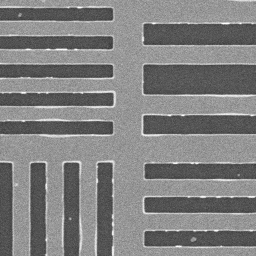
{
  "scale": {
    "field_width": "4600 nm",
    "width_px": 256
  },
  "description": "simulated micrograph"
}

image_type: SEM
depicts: groups of lines, slits or small figures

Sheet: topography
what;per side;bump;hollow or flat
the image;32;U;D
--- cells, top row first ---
UUUUUUUUUUUUUUUUUUUUUUUUUUUUUUUU
DDDDDDDDDDDDDDUUUUUUUUUUUUUUUUUU
DDDDDDDDDDDDDDUUUUUUUUUUUUUUUUUU
UUUUUUUUUUUUUUUUUUDDDDDDDDDDDDDD
DDDDDDDDDDDDDDUUUUDDDDDDDDDDDDDD
DDDDDDDDDDDDDDUUUUDDDDDDDDDDDDDD
UUUUUUUUUUUUUUUUUUUUUUUUUUUUUUUU
UUUUUUUUUUUUUUUUUUUUUUUUUUUUUUUU
DDDDDDDDDDDDDDUUUUDDDDDDDDDDDDDD
DDDDDDDDDDDDDDUUUUDDDDDDDDDDDDDD
UUUUUUUUUUUUUUUUUUDDDDDDDDDDDDDD
UUUUUUUUUUUUDDUUUUDDDDDDDDDDDDDD
DDDDDDDDDDDDDDUUUUUUUUUUUUUUUUUU
UUUUUUUUUUUUUUUUUUUUUUUUUUUUUUUU
UUUUUUUUUUUUUUUUUUDDDDDDDDDDDDDD
DDDDDDDDDDDDDDUUUUDDDDDDDDDDDDDD
DDDDDDDDDDDDDDUUUUDDDDDDDDDDDDDD
UUUUUUUUUUUUUUUUUUUUUUUUUUUUUUUU
UUUUUUUUUUUUUUUUUUUUUUUUUUUUUUUU
UUUUUUUUUUUUUUUUUUUUUUUUUUUUUUUU
DUUUDDUUDDUUDDUUUUDDDDDDDDDDDDDD
DDUUDDUUDDUUDDUUUUDDDDDDDDDDDDDD
DDUUDDUUDDUUDDUUUUUUUUUUUDDDDDDD
DDUUDDUUDDUUDDUUUUUUUUUUUUUUUUUU
DDUUDDUUDDUUDDUUUUUUUUUUUUUUUUUU
DDUUDDUUDDUUDDUUUUDDDDDDDDDDDDDD
DDUUDDUUDDUUDDUUUUDDDDDDDDDDDDDD
DDUUDDUUDDUUDDUUUUUUUUUUUUUUUUUU
DDUUDDUUDDUUDDUUUUUUUUUUUUUUUUUU
DDUUDDUUDDUUDDUUUUDDDDDDDDDDDDDD
DDUUDDUUDDUUDDUUUUDDDDDDDDDDDDDD
DDUUDDUUDDUUDDUUUUUUUUUUUUUUUUUU